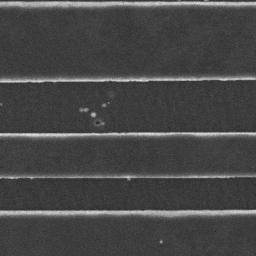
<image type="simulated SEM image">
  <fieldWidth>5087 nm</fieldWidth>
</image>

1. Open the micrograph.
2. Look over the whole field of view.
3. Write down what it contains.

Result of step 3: lines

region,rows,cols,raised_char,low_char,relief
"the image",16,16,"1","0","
1111111111111111
1111111111111111
1111111111111111
1111111111111111
1111111111111111
0000000000000000
0000000000000000
0000000000000000
1111111111111111
1111111111111111
1111111111111111
0000000000000000
0000000000000000
1111111111111111
1111111111111111
1111111111111111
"